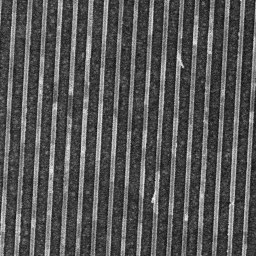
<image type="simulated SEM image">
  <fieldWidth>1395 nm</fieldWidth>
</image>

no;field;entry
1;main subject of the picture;parallel lines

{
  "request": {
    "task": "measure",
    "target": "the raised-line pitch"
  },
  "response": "82.5 nm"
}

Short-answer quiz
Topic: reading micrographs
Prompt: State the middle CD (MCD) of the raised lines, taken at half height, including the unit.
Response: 19 nm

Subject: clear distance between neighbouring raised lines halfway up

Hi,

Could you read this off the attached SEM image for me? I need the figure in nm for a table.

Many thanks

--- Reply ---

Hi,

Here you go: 60.5